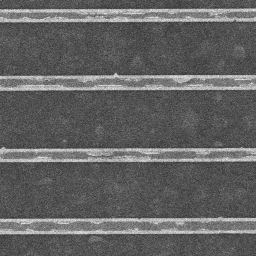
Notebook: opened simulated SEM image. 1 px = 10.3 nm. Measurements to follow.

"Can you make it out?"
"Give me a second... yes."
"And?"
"one or a few lines or trenches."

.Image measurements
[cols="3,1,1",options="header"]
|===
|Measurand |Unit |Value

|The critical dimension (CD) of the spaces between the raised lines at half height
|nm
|617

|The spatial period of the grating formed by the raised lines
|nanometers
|722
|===